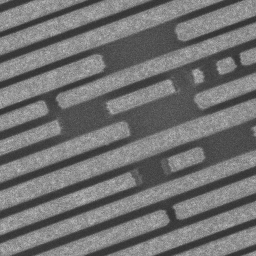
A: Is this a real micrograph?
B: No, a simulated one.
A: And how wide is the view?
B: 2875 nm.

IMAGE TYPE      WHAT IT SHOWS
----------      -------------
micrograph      parallel lines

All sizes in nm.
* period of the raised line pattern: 269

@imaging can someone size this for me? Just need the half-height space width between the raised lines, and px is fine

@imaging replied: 6.81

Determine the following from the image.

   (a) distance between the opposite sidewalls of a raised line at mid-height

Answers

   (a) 195 nm